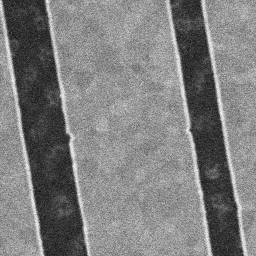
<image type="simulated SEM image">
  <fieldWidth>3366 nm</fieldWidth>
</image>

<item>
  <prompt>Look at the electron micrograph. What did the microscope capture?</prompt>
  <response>one or a few lines or trenches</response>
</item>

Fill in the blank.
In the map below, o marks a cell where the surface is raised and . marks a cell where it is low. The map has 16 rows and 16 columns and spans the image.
...oooooooo..ooo
...oooooooo..ooo
...oooooooo..ooo
o...ooooooo..ooo
o...ooooooo..ooo
o...ooooooo...oo
o...oooooooo..oo
o...oooooooo..oo
o...oooooooo..oo
oo...ooooooo..oo
oo...ooooooo..oo
oo...ooooooo...o
oo...oooooooo..o
oo...oooooooo..o
oo...oooooooo..o
ooo...ooooooo..o